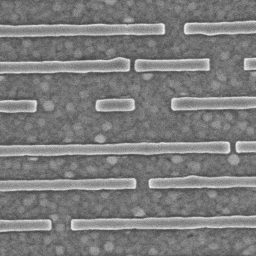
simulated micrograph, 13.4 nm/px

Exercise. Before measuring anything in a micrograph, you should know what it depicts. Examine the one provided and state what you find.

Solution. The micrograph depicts parallel lines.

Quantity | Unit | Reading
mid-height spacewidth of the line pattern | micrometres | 0.366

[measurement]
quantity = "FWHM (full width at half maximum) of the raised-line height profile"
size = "138 nanometres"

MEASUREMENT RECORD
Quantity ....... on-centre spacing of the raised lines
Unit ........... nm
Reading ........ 523